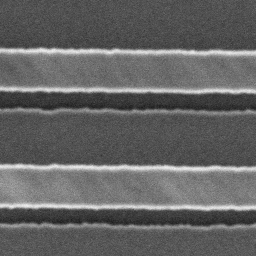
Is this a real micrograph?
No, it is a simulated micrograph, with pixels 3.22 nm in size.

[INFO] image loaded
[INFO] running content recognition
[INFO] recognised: lines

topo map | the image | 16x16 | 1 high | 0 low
0000000000000000
0000000000000000
0000000000000000
1111111111111111
1111111111111111
1111111111111111
0000000000000000
0000000000000000
0000000000000000
0000000000000000
1111111111111111
1111111111111111
1111111111111111
0000000000000000
0000000000000000
0000000000000000